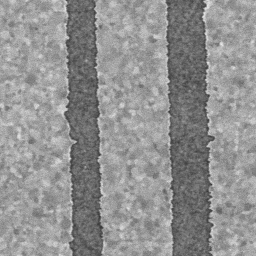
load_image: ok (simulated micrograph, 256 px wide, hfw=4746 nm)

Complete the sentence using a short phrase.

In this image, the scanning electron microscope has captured one or a few lines or trenches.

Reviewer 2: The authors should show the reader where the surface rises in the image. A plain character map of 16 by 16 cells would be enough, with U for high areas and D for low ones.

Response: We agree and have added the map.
UUUUDDUUUUDDDUUU
UUUUDDUUUUDDDUUU
UUUUDDUUUUDDDUUU
UUUUDDUUUUDDDUUU
UUUUDDUUUUDDDUUU
UUUUDDUUUUDDDUUU
UUUUDDUUUUUDDUUU
UUUUDDUUUUUDDUUU
UUUUDDUUUUUDDUUU
UUUUDDUUUUUDDUUU
UUUUDDUUUUUDDUUU
UUUUDDUUUUUDDUUU
UUUUDDUUUUUDDUUU
UUUUDDUUUUUDDUUU
UUUUDDUUUUUDDUUU
UUUUDDUUUUUDDUUU